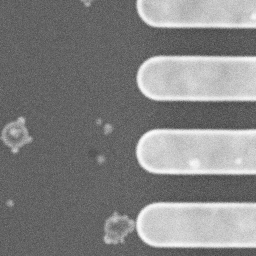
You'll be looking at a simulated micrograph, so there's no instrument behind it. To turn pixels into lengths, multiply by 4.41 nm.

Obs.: groups of lines, slits or small figures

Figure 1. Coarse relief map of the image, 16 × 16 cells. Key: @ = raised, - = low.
---------@@@@@@@
---------@@@@@@@
----------------
----------------
---------@@@@@@@
---------@@@@@@@
----------------
----------------
---------@@@@@@@
---------@@@@@@@
---------@@@@@@@
----------------
----------------
---------@@@@@@@
---------@@@@@@@
----------------